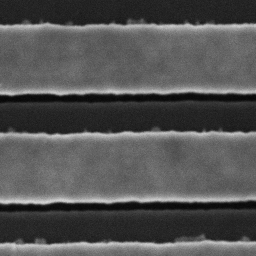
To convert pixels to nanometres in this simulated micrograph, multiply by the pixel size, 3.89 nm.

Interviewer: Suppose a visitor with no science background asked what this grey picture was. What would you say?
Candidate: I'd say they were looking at lines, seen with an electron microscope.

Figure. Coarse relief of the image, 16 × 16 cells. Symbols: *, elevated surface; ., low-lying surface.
................
..*...*.......**
****************
****************
****************
****************
................
................
****************
****************
****************
****************
****************
................
................
****************